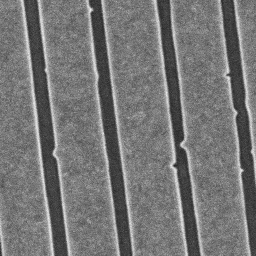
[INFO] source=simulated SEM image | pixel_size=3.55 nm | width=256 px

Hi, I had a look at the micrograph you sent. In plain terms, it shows one or a few lines or trenches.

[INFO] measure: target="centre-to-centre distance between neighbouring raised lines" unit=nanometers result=232